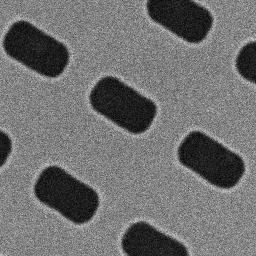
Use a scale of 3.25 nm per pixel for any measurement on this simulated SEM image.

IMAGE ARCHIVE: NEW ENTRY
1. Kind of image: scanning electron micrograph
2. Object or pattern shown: holes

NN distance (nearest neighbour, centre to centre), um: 0.336